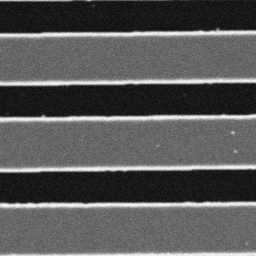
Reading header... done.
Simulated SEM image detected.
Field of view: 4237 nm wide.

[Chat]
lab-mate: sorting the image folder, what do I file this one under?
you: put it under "lines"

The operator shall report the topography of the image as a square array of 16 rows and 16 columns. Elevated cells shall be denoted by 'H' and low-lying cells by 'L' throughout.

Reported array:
LLLLLLLLLLLLLLLL
LLLLLLLLLLLLLLLL
HHHHHHHHHHHHHHHH
HHHHHHHHHHHHHHHH
HHHHHHHHHHHHHHHH
LLLLLLLLLLLLLLLL
LLLLLLLLLLLLLLLL
HHHHHHHHHHHHHHHH
HHHHHHHHHHHHHHHH
HHHHHHHHHHHHHHHH
HHHHHHHHHHHHHHHH
LLLLLLLLLLLLLLLL
LLLLLLLLLLLLLLLL
HHHHHHHHHHHHHHHH
HHHHHHHHHHHHHHHH
HHHHHHHHHHHHHHHH